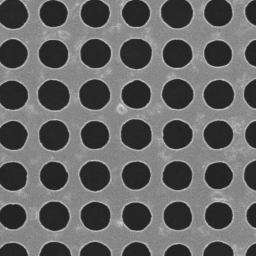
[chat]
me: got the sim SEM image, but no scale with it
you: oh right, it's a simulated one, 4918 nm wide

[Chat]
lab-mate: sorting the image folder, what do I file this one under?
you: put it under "a regular array of holes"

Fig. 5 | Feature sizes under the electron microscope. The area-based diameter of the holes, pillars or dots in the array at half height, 29.6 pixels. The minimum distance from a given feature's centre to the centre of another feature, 776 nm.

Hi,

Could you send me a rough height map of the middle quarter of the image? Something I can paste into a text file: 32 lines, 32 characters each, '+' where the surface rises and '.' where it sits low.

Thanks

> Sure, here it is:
++++++....++++++....++++++....++
++++++++++++++++++++++++++++++++
++++++++++++++++++++++++++++++++
++++++++++++++++++++++++++++++++
++++++....+++++++..+++++++.....+
.++++......++++......++++.......
.+++.......++++.......+++.......
.+++........++........++........
.+++.......+++........+++.......
.+++.......++++......++++.......
+++++.....++++++....++++++.....+
++++++++++++++++++++++++++++++++
++++++++++++++++++++++++++++++++
++++++++++++++++++++++++++++++++
++++++...+++++++....+++++++...++
+++++.....+++++......++++......+
.+++.......+++........+++.......
.+++.......+++........+++.......
.+++.......+++........+++.......
.++++......++++.......+++.......
+++++.....+++++......+++++.....+
++++++++++++++++++++++++++++++++
++++++++++++++++++++++++++++++++
++++++++++++++++++++++++++++++++
++++++...++++++++..++++++++...++
+++++......++++......++++......+
.+++.......++++......++++.......
.+++........++........+++.......
.+++........++........+++.......
.+++.......++++......++++.......
+++++......++++.....++++++.....+
++++++...++++++++.++++++++++.+++